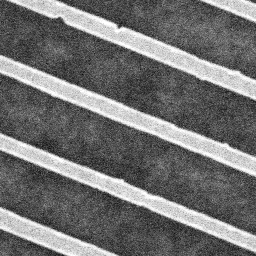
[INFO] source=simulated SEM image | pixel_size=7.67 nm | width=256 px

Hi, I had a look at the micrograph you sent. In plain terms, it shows one or a few lines or trenches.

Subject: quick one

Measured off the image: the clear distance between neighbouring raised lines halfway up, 0.441 µm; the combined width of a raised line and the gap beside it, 548 nm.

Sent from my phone